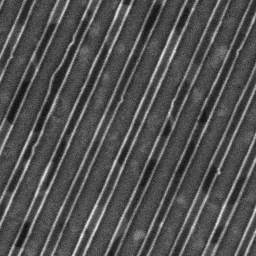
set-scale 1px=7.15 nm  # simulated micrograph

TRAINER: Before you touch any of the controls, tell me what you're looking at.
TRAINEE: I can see parallel lines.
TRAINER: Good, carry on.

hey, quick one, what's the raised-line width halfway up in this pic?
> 67.8 nm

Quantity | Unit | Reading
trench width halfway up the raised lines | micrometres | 0.142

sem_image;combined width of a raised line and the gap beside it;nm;211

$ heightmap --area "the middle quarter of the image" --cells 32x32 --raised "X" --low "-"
XX-----XXX-----XXX------XX-----X
X------XXX-----XXX-----XXX-----X
X------XX------XX------XX-----XX
------XXX-----XXX-----XXX-----XX
------XX------XX------XX------XX
-----XXX-----XXX-----XXX-----XXX
-----XX------XX------XX------XX-
----XXX-----XXX-----XXX-----XXX-
----XX------XXX-----XX------XXX-
---XXX------XX------XX-----XXX--
---XXX-----XXX-----XXX-----XXX--
--XXX------XX------XX------XX---
--XX------XXX-----XXX-----XXX---
-XXX------XX------XX------XX----
-XX------XXX-----XXX-----XXX----
-XX------XX------XX------XXX----
XXX-----XXX-----XXX-----XXX-----
XX------XX------XX------XXX-----
XX-----XXX------XX------XX------
X------XXX-----XX------XXX-----X
X------XX------XX------XX------X
X-----XXX-----XX------XXX-----XX
------XX------XX------XX------XX
-----XXX-----XXX-----XXX-----XXX
-----XX------XX------XX------XX-
----XXX-----XXX-----XXX-----XXX-
----XX------XX------XXX-----XXX-
---XXX------XX------XX-----XXX--
---XXX-----XXX-----XXX-----XXX--
--XXX------XX------XX------XX---
--XXX-----XXX-----XXX-----XXX---
-XXX------XX------XX------XX----